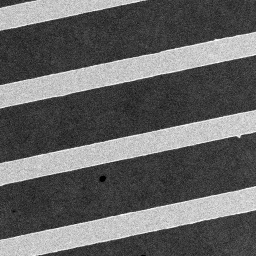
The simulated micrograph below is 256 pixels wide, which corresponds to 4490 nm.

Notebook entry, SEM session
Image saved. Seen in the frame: one or a few lines or trenches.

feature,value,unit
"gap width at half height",951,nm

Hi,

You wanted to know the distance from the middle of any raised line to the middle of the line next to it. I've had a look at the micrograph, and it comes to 1.33 µm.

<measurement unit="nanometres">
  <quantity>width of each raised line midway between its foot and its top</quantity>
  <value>382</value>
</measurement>